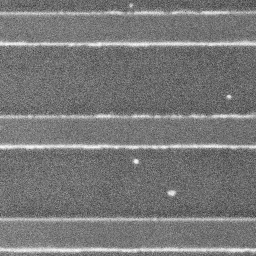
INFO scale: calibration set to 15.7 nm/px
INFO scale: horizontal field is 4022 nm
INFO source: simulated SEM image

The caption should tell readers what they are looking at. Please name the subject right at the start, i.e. lines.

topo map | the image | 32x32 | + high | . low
................................
................................
++++++++++++++++++++++++++++++++
++++++++++++++++++++++++++++++++
++++++++++++++++++++++++++++++++
........+..+.....++.............
................................
................................
................................
................................
................................
................................
................................
................................
................................
++++++++++++++++++++++++++++++++
++++++++++++++++++++++++++++++++
++++++++++++++++++++++++++++++++
................................
................................
................................
................................
................................
................................
................................
................................
................................
++++++++++++++++++++++++++++++++
++++++++++++++++++++++++++++++++
++++++++++++++++++++++++++++++++
++++++++++++++++++++++++++++++++
................................